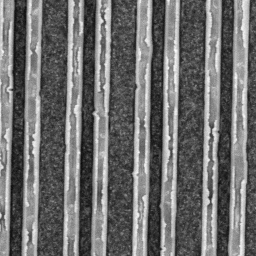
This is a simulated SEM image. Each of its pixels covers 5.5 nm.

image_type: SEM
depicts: parallel lines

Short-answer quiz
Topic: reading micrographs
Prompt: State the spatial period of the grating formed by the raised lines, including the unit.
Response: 190 nm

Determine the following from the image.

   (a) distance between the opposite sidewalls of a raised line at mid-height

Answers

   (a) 72.9 nm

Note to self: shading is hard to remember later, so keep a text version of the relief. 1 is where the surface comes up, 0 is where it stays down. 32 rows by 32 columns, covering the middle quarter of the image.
01110000111000000011100001110000
01110000111000000011100001110000
01110000111000000011100001110000
01110000111000000011100001110000
01110000111000000011100001110000
01110000111000000001100001110000
01110000111000000011100001110000
01110000111000000011100001110000
01110000111000000011100001110000
01110000111000000011100001110000
01110000111000000011100001110000
01110000111000000011100001110000
01110001111000000011100001110000
01110000111000000011100001110000
01110000111000000011100001110000
01110000111000000011100001110000
01110000111000000011100001110000
01110000111000000011100001110000
01110000111000000011100001110000
01110000111000000011100001110000
01110000111000000011100001110000
01110000111000000011100001110000
01110000111000000011100001110000
01110000111000000011100001110000
01110000111000000011100001110000
01110000111000000011100001110000
01110000111000000011100001110000
11110000110000000111100001110000
11110000110000000011100001110000
11110000110000000011100001110000
01110000110000000011100001110000
01110000110000000011100001110000